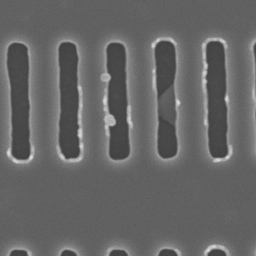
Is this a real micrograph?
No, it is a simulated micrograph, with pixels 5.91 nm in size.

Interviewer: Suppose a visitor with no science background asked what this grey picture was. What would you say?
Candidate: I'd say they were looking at holes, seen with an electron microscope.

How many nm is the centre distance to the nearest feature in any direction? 290